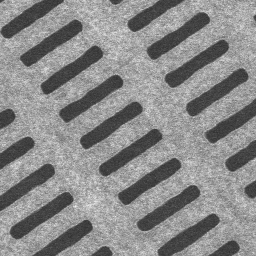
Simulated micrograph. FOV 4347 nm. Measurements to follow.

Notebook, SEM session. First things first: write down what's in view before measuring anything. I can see a regular array of holes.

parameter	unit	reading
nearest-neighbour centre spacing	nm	570